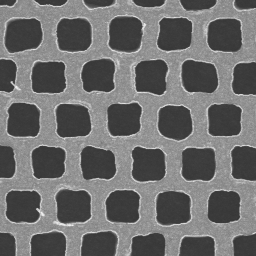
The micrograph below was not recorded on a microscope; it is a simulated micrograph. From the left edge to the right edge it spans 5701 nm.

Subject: a regular array of holes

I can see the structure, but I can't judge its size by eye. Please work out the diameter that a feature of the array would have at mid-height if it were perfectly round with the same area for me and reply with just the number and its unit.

0.796 microns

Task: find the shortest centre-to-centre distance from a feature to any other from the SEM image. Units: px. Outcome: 48.8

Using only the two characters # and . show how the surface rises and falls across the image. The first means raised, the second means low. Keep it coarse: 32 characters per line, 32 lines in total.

..###...###...###...###....##...
################################
##...###...###...###....###...##
#....##....###....##....##....##
#....##....###....##....##....##
#....##....###...###....##....##
#.##########################.###
.###########..#####.############
..##....##....###....##....##...
..##....##....###....##....##...
..##....##....###....##....##...
####....#####.####...###...##...
################################
#....##....###....##...###....##
#....##....##.....##....##....##
#....##....##.....##....##....##
#....##....###...###....##....##
################################
.####..####.#####.######.####...
..##....##....###...###....##...
..##....##....###....##....##...
..##....##....###....##....##...
#################...#####.#####.
################################
#....##....###...###....##....##
#....##....##....###....##....##
#....##....##....###....##....##
#....##....###...###....##....##
################################
.###....###...###...##########..
..##....##....##.....##....##...
..##....##....##.....#.....##...